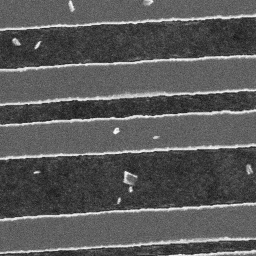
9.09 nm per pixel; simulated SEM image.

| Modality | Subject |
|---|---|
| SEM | lines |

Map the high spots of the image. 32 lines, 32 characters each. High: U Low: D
UUUUUUUUUUUUUUUUUUUUUUUUUUUUUUUU
UUUUUUUUUUUUUUUUUUUUUUUUUUUUUUUU
UUUUUUUUUUUUUUUUUUUUUDDDDDDDDDDD
UUUUUDDDDDDDDDDDDDDDDDDDDDDDDDDD
DDDDDDDDDDDDDDDDDDDDDDDDDDDDDDDD
DDDDDDDDDDDDDDDDDDDDDDDDDDDDDDDD
DDDDDDDDDDDDDDDDDDDDDDDDDDDDDDDD
DDDDDDDDDDDDDDDDDDDDDDUUUUUUUUUU
DDDUUUUUUUUUUUUUUUUUUUUUUUUUUUUU
UUUUUUUUUUUUUUUUUUUUUUUUUUUUUUUU
UUUUUUUUUUUUUUUUUUUUUUUUUUUUUUUU
UUUUUUUUUUUUUUUUUUUUUUUUUUUUDDDD
UUUUUUUUUDDDDDDDDDDDDDDDDDDDDDDD
DDDDDDDDDDDDDDDDDDDDDDDDDDDDDDDD
DDDDDDDDDDDDDDDDDUDUUUUUUUUUUUUU
DDDUUUUUUUUUUUUUUUUUUUUUUUUUUUUU
UUUUUUUUUUUUUUUUUUUUUUUUUUUUUUUU
UUUUUUUUUUUUUUUUUUUUUUUUUUUUUUUU
UUUUUUUUUUUUUUUUUUUUUUUUUUUDDDDD
UUUUUUUDDDDDDDDDDDDDDDDDDDDDDDDD
DDDDDDDDDDDDDDDDDDDDDDDDDDDDDDDD
DDDDDDDDDDDDDDDDDDDDDDDDDDDDDDDD
DDDDDDDDDDDDDDDDUDDDDDDDDDDDDDDD
DDDDDDDDDDDDDDDDDDDDDDDDDDDDDDDD
DDDDDDDDDDDDDDDDDDDDDDDDDDDDDDDD
DDDDDDDDDDDDDDDDDDDDDDDDDDDDDDUU
DDDDDDDDDDDDDUUUUUUUUUUUUUUUUUUU
UUUUUUUUUUUUUUUUUUUUUUUUUUUUUUUU
UUUUUUUUUUUUUUUUUUUUUUUUUUUUUUUU
UUUUUUUUUUUUUUUUUUUUUUUUUUUUUUUU
UUUUUUUUUUUUUUUUUUUDDDDDDDDDDDDD
UUUDDDDDDDDDDDDDDDDDDDDDDDDDDDDU